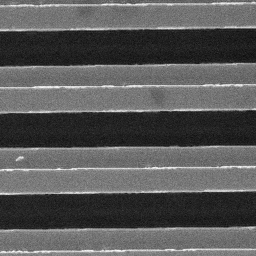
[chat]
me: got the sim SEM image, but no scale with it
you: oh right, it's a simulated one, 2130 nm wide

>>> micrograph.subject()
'lines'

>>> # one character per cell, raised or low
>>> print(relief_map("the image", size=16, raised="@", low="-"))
@@@@@@@@@@@@@@@@
@@@@@@@@@@@@@@@@
----------------
----------------
@@@@@@@@@@@@@@@@
@@@@@@@@@@@@@@@@
@@@@@@@@@@@@@@@@
----------------
----------------
@@@@@@@@@@@@@@@@
@@@@@@@@@@@@@@@@
@@@@@@@@@@@@@@@@
----------------
----------------
@@@@@@@@@@@@@@@@
@@@@@@@@@@@@@@@@